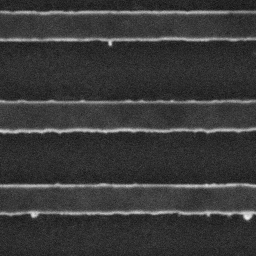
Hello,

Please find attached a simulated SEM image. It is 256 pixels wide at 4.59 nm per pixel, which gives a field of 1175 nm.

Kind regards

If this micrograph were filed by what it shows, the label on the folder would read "lines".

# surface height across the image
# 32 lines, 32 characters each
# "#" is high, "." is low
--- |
................................
#####.##..######################
################################
################################
################################
................................
................................
................................
................................
................................
................................
................................
................................
################################
################################
################################
.##.............................
................................
................................
................................
................................
................................
................................
################################
################################
################################
################################
................................
................................
................................
................................
................................